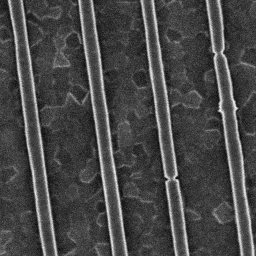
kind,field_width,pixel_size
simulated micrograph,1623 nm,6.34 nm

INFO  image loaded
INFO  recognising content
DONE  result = one or a few lines or trenches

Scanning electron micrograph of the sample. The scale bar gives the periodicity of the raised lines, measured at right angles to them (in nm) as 414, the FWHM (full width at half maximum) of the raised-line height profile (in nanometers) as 81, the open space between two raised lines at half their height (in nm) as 337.